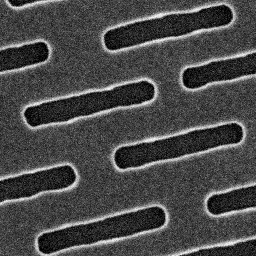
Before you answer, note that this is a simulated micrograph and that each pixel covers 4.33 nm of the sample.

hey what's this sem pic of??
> holes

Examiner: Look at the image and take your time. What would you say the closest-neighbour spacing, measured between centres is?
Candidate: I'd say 0.448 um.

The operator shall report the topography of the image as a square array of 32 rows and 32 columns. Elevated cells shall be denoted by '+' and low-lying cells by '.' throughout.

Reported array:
+...++++++++++++++++++++++++++++
++++++++++++++++++++++++.....+++
++++++++++++++++++...........+++
+++++++++++++++...........++++++
+++++++++++++..........+++++++++
+++...+++++++.....++++++++++++++
......++++++++++++++++++++++++++
......++++++++++++++++++++++....
...+++++++++++++++++++++........
+++++++++++++++++++++++.......++
++++++++++++++++...++++...++++++
++++++++++++.......+++++++++++++
+++++++............+++++++++++++
+++...........++++++++++++++++++
+++.......++++++++++++++++++++++
++++..++++++++++++++++++++++..++
+++++++++++++++++++++++.......++
+++++++++++++++++++...........++
+++++++++++++++............+++++
++++++++++++++.........+++++++++
+++++++++++++++....+++++++++++++
++++.....+++++++++++++++++++++++
.........+++++++++++++++++++++++
........++++++++++++++++++++++..
....++++++++++++++++++++++......
++++++++++++++++++++++++++......
++++++++++++++++....++++++...+++
+++++++++++++........+++++++++++
++++++++............++++++++++++
+++++...........++++++++++++++++
+++++......++++++++++++++++++...
+++++..+++++++++++++++++........